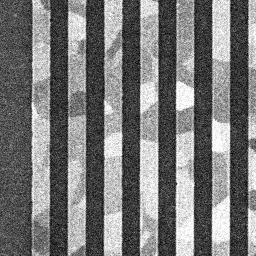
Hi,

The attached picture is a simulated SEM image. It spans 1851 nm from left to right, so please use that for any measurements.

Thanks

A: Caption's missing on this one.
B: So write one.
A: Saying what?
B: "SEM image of parallel lines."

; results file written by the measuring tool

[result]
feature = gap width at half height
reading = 143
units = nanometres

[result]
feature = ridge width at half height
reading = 118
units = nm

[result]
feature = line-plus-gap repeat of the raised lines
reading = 0.26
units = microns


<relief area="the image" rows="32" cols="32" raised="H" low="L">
LLLLHHLLLHHLLHHLLLHHLLHHLLLHHLLH
LLLLHHLLLHHLLHHLLLHHLLHHLLLHHLLH
LLLLHHLLLHHLLHHLLLHHLLHHLLLHHLLH
LLLLHHLLLHHLLHHLLLHHLLHHLLLHHLLH
LLLLHHLLLHHLLHHLLLHHLLHHLLLHHLLH
LLLLHHLLLHHLLHHLLLHHLLHHLLLHHLLH
LLLLHHLLLHHLLHHLLLHHLLHHLLLHHLLH
LLLLHHLLLHHLLHHLLLHHLLHHLLLHHLLH
LLLLHHLLLHHLLHHLLLHHLLHHLLLHHLLH
LLLLHHLLLHHLLHHLLLHHLLHHLLLHHLLH
LLLLHHLLLHHLLHHLLLHHLLHHLLLHHLLH
LLLLHHLLLHHLLHHLLLHHLLHHLLLHHLLH
LLLLHHLLLHHLLHHLLLHHLLHHLLLHHLLH
LLLLHHLLLHHLLHHLLLHHLLHHLLLHHLLH
LLLLHHLLLHHLLHHLLLHHLLHHLLLHHLLH
LLLLHHLLLHHLLHHLLLHHLLHHLLLHHLLH
LLLLHHLLLHHLLHHLLLHHLLHHLLLHHLLH
LLLLHHLLLHHLLHHLLLHHLLHHLLLHHLLH
LLLLHHLLLHHLLHHLLLHHLLHHLLLHHLLH
LLLLHHLLLHHLLHHLLLHHLLHHLLLHHLLH
LLLLHHLLLHHLLHHLLLHHLLHHLLLHHLLH
LLLLHHLLLHHLLHHLLLHHLLHHLLLHHLLH
LLLLHHLLLHHLLHHLLLHHLLHHLLLHHLLH
LLLLHHLLLHHLLHHLLLHHLLHHLLLHHLLH
LLLLHHLLLHHLLHHLLLHHLLHHLLLHHLLH
LLLLHHLLLHHLLHHLLLHHLLHHLLLHHLLH
LLLLHHLLLHHLLHHLLLHHLLHHLLLHHLLH
LLLLHHLLLHHLLHHLLLHHLLHHLLLHHLLH
LLLLHHLLLHHLLHHLLLHHLLHHLLLHHLLH
LLLLHHLLLHHLLHHLLLHHLLHHLLLHHLLH
LLLLHHLLLHHLLHHLLLHHLLHHLLLHHLLH
LLLLHHLLLHHLLHHLLLHHLLHHLLLHHLLH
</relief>